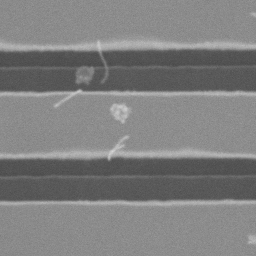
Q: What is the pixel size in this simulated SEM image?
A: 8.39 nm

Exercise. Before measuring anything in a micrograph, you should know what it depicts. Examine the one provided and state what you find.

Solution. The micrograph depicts lines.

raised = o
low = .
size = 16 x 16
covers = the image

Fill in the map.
oooooooooooooooo
oooooooooooooooo
oooooooooooooooo
................
................
................
oooooooooooooooo
oooooooooooooooo
oooooooooooooooo
oooooooooooooooo
................
................
................
oooooooooooooooo
oooooooooooooooo
oooooooooooooooo